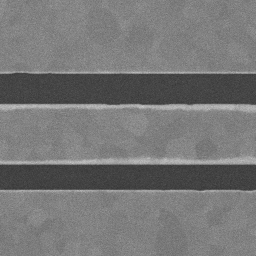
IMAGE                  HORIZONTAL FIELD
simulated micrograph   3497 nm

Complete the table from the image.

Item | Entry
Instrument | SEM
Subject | lines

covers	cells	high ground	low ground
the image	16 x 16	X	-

XXXXXXXXXXXXXXXX
XXXXXXXXXXXXXXXX
XXXXXXXXXXXXXXXX
XXXXXXXXXXXXXXXX
XXXXXXXXXXXXXXXX
----------------
----------------
XXXXXXXXXXXXXXXX
XXXXXXXXXXXXXXXX
XXXXXXXXXXXXXXXX
----------------
----------------
XXXXXXXXXXXXXXXX
XXXXXXXXXXXXXXXX
XXXXXXXXXXXXXXXX
XXXXXXXXXXXXXXXX